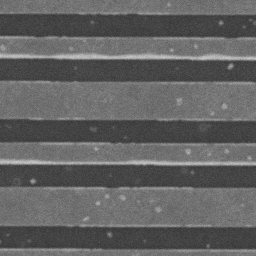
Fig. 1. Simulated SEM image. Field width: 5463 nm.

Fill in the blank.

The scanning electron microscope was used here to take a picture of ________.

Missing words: lines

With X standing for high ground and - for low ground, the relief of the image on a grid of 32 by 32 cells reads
XXXXXXXXXXXXXXXXXXXXXXXXXXXXXXXX
XXXXXXXXXXXXXXXXXXXXXXXXXXXXXXXX
--------------------------------
--------------------------------
--------------------------------
XXXXXXXXXXXXXXXXXXXXXXXXXXXXXXXX
XXXXXXXXXXXXXXXXXXXXXXXXXXXXXXXX
--------------------------------
--------------------------------
--------------------------------
XXXXXXXXXXXXXXXXXXXXXXXXXXXXXXXX
XXXXXXXXXXXXXXXXXXXXXXXXXXXXXXXX
XXXXXXXXXXXXXXXXXXXXXXXXXXXXXXXX
XXXXXXXXXXXXXXXXXXXXXXXXXXXXXXXX
XXXXXXXXXXXXXXXXXXXXXXXXXXXXXXXX
--------------------------------
--------------------------------
--------------------------------
XXXXXXXXXXXXXXXXXXXXXXXXXXXXXXXX
XXXXXXXXXXXXXXXXXXXXXXXXXXXXXXXX
--------------------------------
--------------------------------
--------------------------------
XXXXXXXXXXXXX--XXXXXXXXX--------
XXXXXXXXXXXXXXXXXXXXXXXXXXXXXXXX
XXXXXXXXXXXXXXXXXXXXXXXXXXXXXXXX
XXXXXXXXXXXXXXXXXXXXXXXXXXXXXXXX
XXXXXXXXXXXXXXXXXXXXXXXXXXXXXXXX
--------------------------------
--------------------------------
--------------------------------
XXXXXXXXXXXXXXXXXXXXXXXXXXXXXXXX